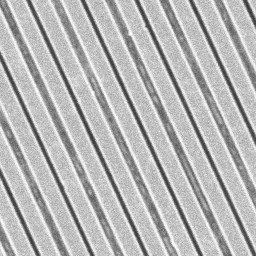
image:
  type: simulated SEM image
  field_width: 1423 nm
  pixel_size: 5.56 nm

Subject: parallel lines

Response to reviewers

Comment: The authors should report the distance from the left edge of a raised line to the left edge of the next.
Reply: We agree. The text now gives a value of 136 nm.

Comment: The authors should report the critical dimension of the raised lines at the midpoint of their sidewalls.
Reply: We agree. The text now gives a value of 0.0965 micrometres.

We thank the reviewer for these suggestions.